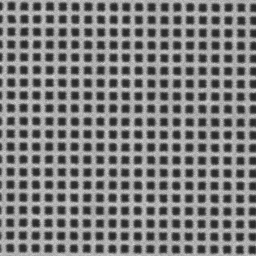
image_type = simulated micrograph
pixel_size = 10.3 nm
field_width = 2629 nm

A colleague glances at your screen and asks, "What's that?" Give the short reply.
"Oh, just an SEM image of a regular array of holes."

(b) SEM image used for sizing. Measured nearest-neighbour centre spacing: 0.129 um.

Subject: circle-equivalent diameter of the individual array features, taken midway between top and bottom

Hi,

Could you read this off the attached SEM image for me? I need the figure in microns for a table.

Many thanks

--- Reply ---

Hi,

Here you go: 0.0996